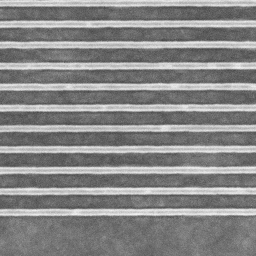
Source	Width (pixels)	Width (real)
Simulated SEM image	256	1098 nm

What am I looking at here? parallel lines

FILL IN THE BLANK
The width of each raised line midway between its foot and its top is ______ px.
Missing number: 5.87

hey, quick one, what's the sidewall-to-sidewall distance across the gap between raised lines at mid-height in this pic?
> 15.7 pixels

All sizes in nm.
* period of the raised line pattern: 89.7